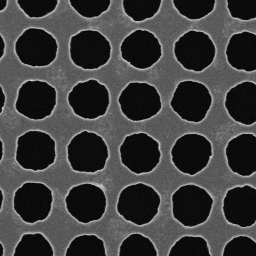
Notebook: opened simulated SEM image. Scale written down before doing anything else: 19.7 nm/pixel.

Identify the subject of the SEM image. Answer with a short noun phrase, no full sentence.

a regular array of holes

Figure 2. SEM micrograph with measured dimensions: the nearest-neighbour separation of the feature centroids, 1000 nanometres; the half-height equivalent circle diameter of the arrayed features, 790 nm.